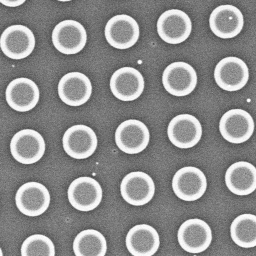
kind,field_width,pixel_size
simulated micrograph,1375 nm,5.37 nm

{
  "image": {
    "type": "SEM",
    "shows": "an array of small figures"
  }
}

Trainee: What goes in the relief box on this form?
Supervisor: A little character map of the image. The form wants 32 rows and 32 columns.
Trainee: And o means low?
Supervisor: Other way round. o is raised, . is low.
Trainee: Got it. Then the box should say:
ooo.............................
.....................oo....ooo..
..............ooo...oooo..oooo..
.oo....ooo...oooo...oooo..oooo..
oooo...oooo..oooo...oooo...oo...
oooo...oooo...ooo...............
oooo....oo......................
............................oo..
...............o.....ooo...oooo.
........ooo...oooo..ooooo..oooo.
.ooo...oooo...oooo..oooo...oooo.
.oooo..oooo...oooo...ooo........
.oooo...ooo....oo...............
..oo............................
......................oo....ooo.
...............ooo...oooo..ooooo
..ooo...oooo...oooo..oooo...oooo
..ooo...oooo..ooooo..oooo...ooo.
.ooooo..oooo...ooo..............
..ooo....oo.....................
.............................oo.
......................ooo...oooo
.........ooo...oooo...oooo..oooo
..oooo...oooo..oooo...oooo...ooo
..oooo...oooo..oooo...ooo.......
..oooo...ooo....oo..............
...oo...........................
........................o....ooo
.................oo...oooo...ooo
....o.....ooo...oooo..oooo...ooo
...oooo..oooo...oooo...ooo....oo
...oooo..oooo...ooo.....o.......